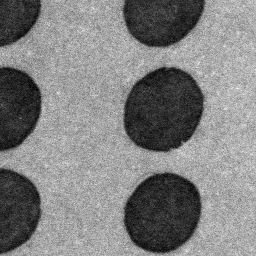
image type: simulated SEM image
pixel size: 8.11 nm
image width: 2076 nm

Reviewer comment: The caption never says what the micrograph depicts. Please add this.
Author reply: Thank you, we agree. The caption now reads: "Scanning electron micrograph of holes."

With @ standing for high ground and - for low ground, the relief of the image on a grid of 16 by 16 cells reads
---@@@@@-----@@@
--@@@@@@----@@@@
-@@@@@@@@--@@@@@
@@@@@@@@@@@@@@@@
-@@@@@@@@---@@@@
--@@@@@@----@@@@
---@@@@@-----@@@
--@@@@@@----@@@@
--@@@@@@----@@@@
@@@@@@@@@@@@@@@@
@@@@@@@@@@@@@@@@
--@@@@@@@---@@@@
---@@@@@-----@@@
--@@@@@@-----@@@
--@@@@@@----@@@@
-@@@@@@@@--@@@@@